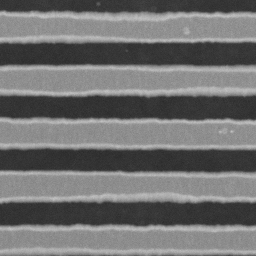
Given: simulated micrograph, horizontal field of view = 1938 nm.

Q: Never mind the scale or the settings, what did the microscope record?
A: lines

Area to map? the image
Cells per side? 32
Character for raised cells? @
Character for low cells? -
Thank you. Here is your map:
--------------------------------
@-------------------------------
@@@@@@@@@@@@@@@@@@@@@@@@@@@@@@@@
@@@@@@@@@@@@@@@@@@@@@@@@@@@@@@@@
@@@@@@@@@@@@@@@@@@@@@@@@@@@@@@@@
--------------------------------
--------------------------------
--------------------------------
@@@@@@@@@@@@@@@@@@@@@@@@@@@@@@@@
@@@@@@@@@@@@@@@@@@@@@@@@@@@@@@@@
@@@@@@@@@@@@@@@@@@@@@@@@@@@@@@@@
@@@@@@@@@@@@@@@@@@@@@@@@@@@@@@@@
--------------------------------
--------------------------------
--------------------------------
@@@@@@@@@@@@@@@@@@@@@@@@@@@@@@@@
@@@@@@@@@@@@@@@@@@@@@@@@@@@@@@@@
@@@@@@@@@@@@@@@@@@@@@@@@@@@@@@@@
@-@------@----@@@@@@@@@@@@@@@@@@
--------------------------------
--------------------------------
@@@@@@@@@@-@@-@@----------------
@@@@@@@@@@@@@@@@@@@@@@@@@@@@@@@@
@@@@@@@@@@@@@@@@@@@@@@@@@@@@@@@@
@@@@@@@@@@@@@@@@@@@@@@@@@@@@@@@@
--------------------------------
--------------------------------
--------------------------------
@@@@@@@@@@@@@@@@@@@@@@@@@@@@@@@@
@@@@@@@@@@@@@@@@@@@@@@@@@@@@@@@@
@@@@@@@@@@@@@@@@@@@@@@@@@@@@@@@@
@@@@@@@@@@@@@@@@@@@@@@@@@@@@@@@@